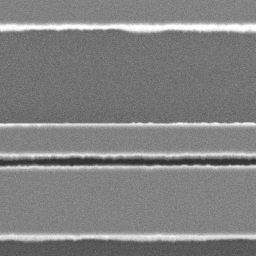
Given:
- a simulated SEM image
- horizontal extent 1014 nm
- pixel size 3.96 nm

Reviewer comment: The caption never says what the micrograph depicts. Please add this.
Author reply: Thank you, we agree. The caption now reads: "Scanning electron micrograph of lines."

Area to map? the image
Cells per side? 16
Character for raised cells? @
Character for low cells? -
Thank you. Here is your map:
@@@@@@@@@@@@@@@@
@@@@@@@@@@@@@@@@
----------------
----------------
----------------
----------------
----------------
----------------
@@@@@@@@@@@@@@@@
@@@@@@@@@@@@@@@@
@@@@@@@@@@@@@@@@
@@@@@@@@@@@@@@@@
@@@@@@@@@@@@@@@@
@@@@@@@@@@@@@@@@
@@@@@@@@@@@@@@@@
----------------